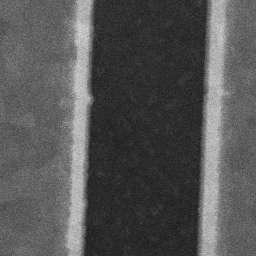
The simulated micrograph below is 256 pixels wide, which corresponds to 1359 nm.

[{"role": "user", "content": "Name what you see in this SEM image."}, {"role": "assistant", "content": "one or a few lines or trenches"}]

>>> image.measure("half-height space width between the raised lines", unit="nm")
719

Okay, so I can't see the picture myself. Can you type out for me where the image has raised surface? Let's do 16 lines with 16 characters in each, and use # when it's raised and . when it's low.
#####.........##
#####.........##
#####.........##
#####.........##
#####.........##
#####.........##
#####........###
#####........###
#####........###
#####........###
#####........###
#####........###
#####........###
#####........###
#####........###
#####........###